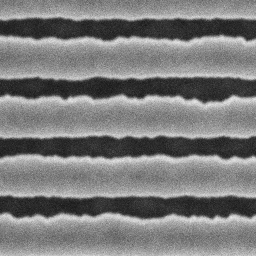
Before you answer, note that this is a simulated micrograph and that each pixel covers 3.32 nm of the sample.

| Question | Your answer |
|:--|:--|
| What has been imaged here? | lines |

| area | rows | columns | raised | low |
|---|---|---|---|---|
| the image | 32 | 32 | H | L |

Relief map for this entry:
HHHHHHHHHHHHHHHHHHHHHHHHHHHHHHHH
HHHHHHHHHHHHHHHHHHHHHHHHHHHHHHHH
HLLLLLLLLHLLLLLLHLLLLLLLLLLLLLLL
LLLLLLLLLLLLLLLLLLLLLLLLLLLLLLLL
LLLLLLLLLLLLLLLLLLLLLLLLLLLHLLLL
HHHHHHHHHHHHHHHHHHHHHHHHHHHHHHHH
HHHHHHHHHHHHHHHHHHHHHHHHHHHHHHHH
HHHHHHHHHHHHHHHHHHHHHHHHHHHHHHHH
HHHHHHHHHHHHHHHHHHHHHHHHHHHHHHHH
HHHHHHHHHHHHHHHHHHHHHHHHHHHHHHHH
LLLLLLLLLLLLLLLLLLLLLLLLLLLLLLLL
LLLLLLLLLLLLLLLLLLLLLLLLLLLLLLLL
HHHHHHHHHHHHHHHHHHHHHHHLHLLLHHHH
HHHHHHHHHHHHHHHHHHHHHHHHHHHHHHHH
HHHHHHHHHHHHHHHHHHHHHHHHHHHHHHHH
HHHHHHHHHHHHHHHHHHHHHHHHHHHHHHHH
HHHHHHHHHHHHHHHHHHHHHHHHHHHHHHHH
LLLLLLLLLLLLLLLLLLLLLLLLLLLLLLLL
LLLLLLLLLLLLLLLLLLLLLLLLLLLLLLLL
LLHHHLLLLLLLLLLLLLLHHLLLHLLLLLLL
HHHHHHHHHHHHHHHHHHHHHHHHHHHHHHHH
HHHHHHHHHHHHHHHHHHHHHHHHHHHHHHHH
HHHHHHHHHHHHHHHHHHHHHHHHHHHHHHHH
HHHHHHHHHHHHHHHHHHHHHHHHHHHHHHHH
LLHHHHHHHHHHHHHHLHHHHHHLHHHHLHHH
LLLLLLLLLLLLLLLLLLLLLLLLLLLLLLLL
LLLLLLLLLLLLLLLLLLLLLLLLLLLLLLLL
HHHHHHHHHHHHHHHHHHHHHHHHHHHHHHHH
HHHHHHHHHHHHHHHHHHHHHHHHHHHHHHHH
HHHHHHHHHHHHHHHHHHHHHHHHHHHHHHHH
HHHHHHHHHHHHHHHHHHHHHHHHHHHHHHHH
HHHHHHHHHHHHHHHHHHHHHHHHHHHHHHHH